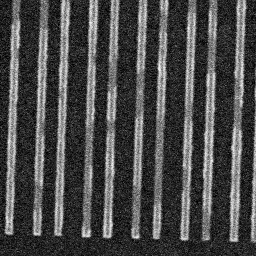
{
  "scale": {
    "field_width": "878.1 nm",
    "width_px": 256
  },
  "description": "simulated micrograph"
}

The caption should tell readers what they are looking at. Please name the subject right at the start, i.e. parallel lines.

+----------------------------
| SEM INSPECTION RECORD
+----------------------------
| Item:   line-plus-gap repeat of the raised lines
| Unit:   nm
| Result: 85.7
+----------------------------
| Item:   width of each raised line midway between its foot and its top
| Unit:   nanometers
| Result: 23.6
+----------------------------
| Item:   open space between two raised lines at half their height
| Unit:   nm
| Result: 65.1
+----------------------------